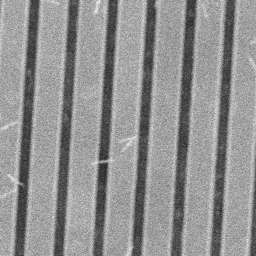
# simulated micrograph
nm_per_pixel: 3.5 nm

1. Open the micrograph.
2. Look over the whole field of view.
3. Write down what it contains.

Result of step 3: parallel lines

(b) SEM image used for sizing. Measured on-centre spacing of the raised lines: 137 nm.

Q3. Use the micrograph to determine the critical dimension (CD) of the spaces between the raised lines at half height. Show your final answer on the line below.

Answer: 0.0419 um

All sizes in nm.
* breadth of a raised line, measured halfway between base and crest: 92.9